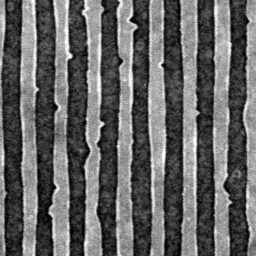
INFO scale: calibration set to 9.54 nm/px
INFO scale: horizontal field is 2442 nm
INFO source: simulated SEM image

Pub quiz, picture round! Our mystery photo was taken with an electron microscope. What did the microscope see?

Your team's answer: parallel lines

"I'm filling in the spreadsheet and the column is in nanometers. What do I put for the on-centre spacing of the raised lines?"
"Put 306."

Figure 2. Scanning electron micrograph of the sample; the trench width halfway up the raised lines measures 184 nm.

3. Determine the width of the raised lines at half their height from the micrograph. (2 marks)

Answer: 0.12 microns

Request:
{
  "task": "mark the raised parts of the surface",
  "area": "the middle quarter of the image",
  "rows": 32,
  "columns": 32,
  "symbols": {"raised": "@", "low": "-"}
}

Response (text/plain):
@-----@@@-----@@@-----@@------@@
@-----@@@-----@@@----@@@@-----@@
@-----@@@-----@@@----@@@@-----@@
@-----@@@-----@@@----@@@@-----@@
@-----@@@-----@@@----@@@@-----@@
@-----@@@-----@@@----@@@@-----@@
@-----@@@-----@@@----@@@@-----@@
@-----@@@-----@@@----@@@@-----@@
@-----@@@-----@@@----@@@@-----@@
@-----@@@-----@@@----@@@@-----@@
@-----@@@-----@@@----@@@@-----@@
@-----@@@-----@@@----@@@@-----@@
@-----@@@-----@@@----@@@@-----@@
@-----@@@-----@@@----@@@@-----@@
@-----@@@-----@@@----@@@@-----@@
------@@@-----@@@----@@@@-----@@
------@@@-----@@@----@@@@-----@@
@-----@@@-----@@@----@@@@@----@@
------@@@-----@@@-----@@@-----@@
------@@------@@@-----@@@-----@@
------@@-----@@@@-----@@@-----@@
@------@@-----@@@-----@@@-----@@
@------@@-----@@@-----@@@-----@@
@-----@@@-----@@@-----@@@-----@@
@-----@@@-----@@@-----@@@-----@@
@----@@@@-----@@------@@@-----@@
@----@@@------@@------@@@-----@@
@-----@@------@@@-----@@@-----@@
@-----@@------@@@-----@@@-----@@
@-----@@------@@@-----@@@-----@@
@-----@@------@@@-----@@@-----@@
@-----@@-----@@@@-----@@@-----@@